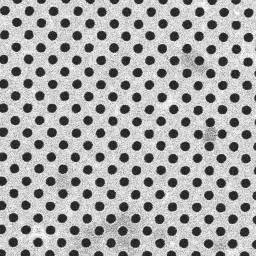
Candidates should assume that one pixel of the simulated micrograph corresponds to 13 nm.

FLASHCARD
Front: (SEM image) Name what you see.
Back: a regular array of holes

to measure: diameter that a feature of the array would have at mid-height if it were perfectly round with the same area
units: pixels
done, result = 9.64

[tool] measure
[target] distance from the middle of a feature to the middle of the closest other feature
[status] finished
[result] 219 nanometers